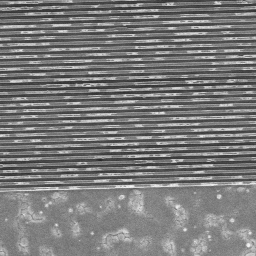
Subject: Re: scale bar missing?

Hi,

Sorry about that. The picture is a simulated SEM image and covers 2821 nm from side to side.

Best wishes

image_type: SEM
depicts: parallel lines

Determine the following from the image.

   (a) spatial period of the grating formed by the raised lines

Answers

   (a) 0.0664 um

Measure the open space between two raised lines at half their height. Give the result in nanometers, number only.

38.5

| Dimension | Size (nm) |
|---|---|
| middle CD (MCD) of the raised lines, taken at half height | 28.9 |